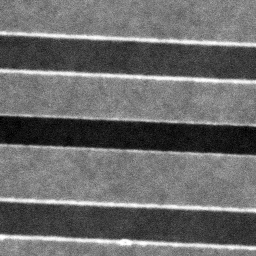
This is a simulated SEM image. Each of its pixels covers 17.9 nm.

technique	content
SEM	lines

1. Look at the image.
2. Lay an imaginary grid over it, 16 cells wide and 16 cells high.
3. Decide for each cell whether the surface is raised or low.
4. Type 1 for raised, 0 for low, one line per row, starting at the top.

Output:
1111111111111111
1111111111111111
0000000000111111
0000000000000000
1000000000000000
1111111111111111
1111111111111111
0000000011111111
0000000000000000
1111111111000000
1111111111111111
1111111111111111
0111111111111111
0000000000000000
0000000000000000
1111111111111111